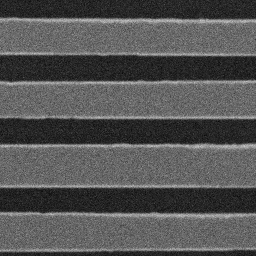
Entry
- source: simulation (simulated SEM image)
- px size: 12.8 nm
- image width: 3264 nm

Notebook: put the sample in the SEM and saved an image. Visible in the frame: lines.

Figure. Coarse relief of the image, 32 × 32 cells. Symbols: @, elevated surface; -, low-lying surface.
--------------------------------
--------------------------------
@@@@@@@@@@@@@@@@@@@@@@@@@@@@@@@@
@@@@@@@@@@@@@@@@@@@@@@@@@@@@@@@@
@@@@@@@@@@@@@@@@@@@@@@@@@@@@@@@@
@@@@@@@@@@@@@@@@@@@@@@@@@@@@@@@@
@@@@@@@@@@@@@@@@@@@@@@@@@@@@@@@@
--------------------------------
--------------------------------
--------------------------------
@@@@@@@@@@@@@@@@@@@@@@@@@@@@@@@@
@@@@@@@@@@@@@@@@@@@@@@@@@@@@@@@@
@@@@@@@@@@@@@@@@@@@@@@@@@@@@@@@@
@@@@@@@@@@@@@@@@@@@@@@@@@@@@@@@@
@@@@@@@@@@@@@@@@@@@@@@@@@@@@@@@@
--------------------------------
--------------------------------
--------------------------------
@@@@@@@@@@@@@@@@@@@@@@@@@@@@@@@@
@@@@@@@@@@@@@@@@@@@@@@@@@@@@@@@@
@@@@@@@@@@@@@@@@@@@@@@@@@@@@@@@@
@@@@@@@@@@@@@@@@@@@@@@@@@@@@@@@@
@@@@@@@@@@@@@@@@@@@@@@@@@@@@@@@@
--------------------------------
--------------------------------
--------------------------------
--------------------------------
@@@@@@@@@@@@@@@@@@@@@@@@@@@@@@@@
@@@@@@@@@@@@@@@@@@@@@@@@@@@@@@@@
@@@@@@@@@@@@@@@@@@@@@@@@@@@@@@@@
@@@@@@@@@@@@@@@@@@@@@@@@@@@@@@@@
--------------------------------